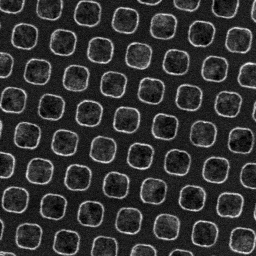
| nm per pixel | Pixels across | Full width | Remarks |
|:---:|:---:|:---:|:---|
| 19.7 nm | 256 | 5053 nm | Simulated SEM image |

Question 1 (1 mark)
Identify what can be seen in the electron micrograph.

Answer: a regular array of raised bodies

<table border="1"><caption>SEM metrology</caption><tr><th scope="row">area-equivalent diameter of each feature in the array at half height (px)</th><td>25.6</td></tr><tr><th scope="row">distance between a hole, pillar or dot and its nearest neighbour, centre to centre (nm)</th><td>742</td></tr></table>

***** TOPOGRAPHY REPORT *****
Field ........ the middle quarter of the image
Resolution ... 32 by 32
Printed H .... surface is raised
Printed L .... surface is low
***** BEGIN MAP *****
LLHLLLLLLLLLLLLLLHHHHLLLLHHHHHHL
LHHHHHLLLLLLLLLLLLLLLLLLLHHHHHHL
HHHHHHLLLLHHHHLLLLLLLLLLLLLLHLLL
HHHHHHLLLLHHHHHLLLLLLLLLLLLLLLLL
HLLHHHLLLHHHHHHHLLLHHHHHLLLLLLLL
HLLHHHLLLHHHHHHLLLLHHHHHHLLLLLHL
LLHHLLLLLHHHHHHLLLLHHHHHHLLLLHHH
LLLLLLLLLLHHHHHLLLLHHHHHHLLLHHHH
LLLLLLLLLLLLLLLLLLLHHHHHLLLLHHHH
LLLLLHHLLLLLLLLLLLLLLHHHLLLLHHHH
LLLLHHHHHLLLLLLLLLLLLLLLLLLLLHHH
LLLHHHHHHLLLLHHHHHLLLLLLLLLLLLLL
LLLHHHHHHLLLLHHHHHHLLLLLLLLLLLLL
LLLHHHHHHLLLLHHHHHHLLLLHHHHHLLLL
LLLLHHHHHLLLLHHHHHHLLLHHHHHHLLLL
LLLLLLLLLLLLLHHHHHLLLLHHHHHHLLLL
LLLLLLLLLLLLLHHHHHLLLLHHHHHHLLLL
HHHLLLLLLLLLLLLLLLLLLLHHHHHHLLLL
HHHLLLLLHHLLLLLLLLLLLLLLHHHLLLLL
HHHLLLLHHHHHHLLLLLLLLLLLLLLLLLLL
HHHLLLLHHHHHHLLLLHHHHLLLLLLLLLLL
HHHLLLLHHHHHHLLLHHHHHHLLLLLHLLLL
HHLLLLLHHHHHHLLLHHHHHHLLLLHHHHHL
LLLLLLLHHHHHLLLLHHHHHHLLLHHHHHHL
LLLLLLLLLLHLLLLLHHHHHHLLLHHHHHHL
LLHHLLLLLLLLLLLLLHHHHLLLLHHHHHHL
LHHHHHLLLLLLLLLLLLLLLLLLLLHHHHHL
LHHHHHHLLLLHHHLLLLLLLLLLLLLLHHLL
LHHHHHHLLLHHHHHHLLLLLLLLLLLLLLLL
HHHHHHLLLLHHHHHHLLLLHHHHHLLLLLLL
LHHHHHLLLLHHHHHHLLLLHHHHHLLLLLLL
LLLLLLLLLLHHHHHHLLLHHHHHHLLLLLHH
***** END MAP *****